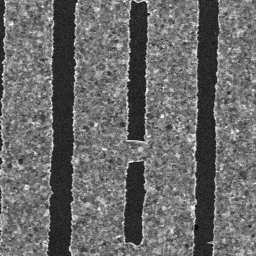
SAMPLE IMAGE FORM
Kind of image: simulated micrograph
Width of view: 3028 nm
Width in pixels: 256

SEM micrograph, one or a few lines or trenches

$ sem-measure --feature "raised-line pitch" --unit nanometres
842